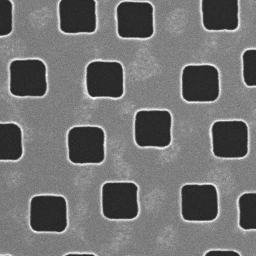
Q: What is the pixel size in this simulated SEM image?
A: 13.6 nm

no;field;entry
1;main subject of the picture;a regular array of holes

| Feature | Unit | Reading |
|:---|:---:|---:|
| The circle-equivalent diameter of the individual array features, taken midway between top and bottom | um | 0.542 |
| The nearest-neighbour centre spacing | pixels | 66.1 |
